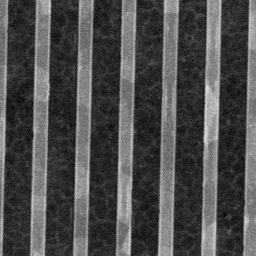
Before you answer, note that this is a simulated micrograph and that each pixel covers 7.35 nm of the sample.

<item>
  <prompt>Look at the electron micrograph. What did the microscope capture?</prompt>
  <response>parallel lines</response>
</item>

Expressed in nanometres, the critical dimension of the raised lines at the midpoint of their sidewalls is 96.5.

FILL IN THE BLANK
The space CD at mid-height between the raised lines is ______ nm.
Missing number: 219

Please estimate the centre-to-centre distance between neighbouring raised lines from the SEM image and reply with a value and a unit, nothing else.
0.313 um